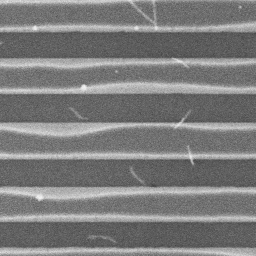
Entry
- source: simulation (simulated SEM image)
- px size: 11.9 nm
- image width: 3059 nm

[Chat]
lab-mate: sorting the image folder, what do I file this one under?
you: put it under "lines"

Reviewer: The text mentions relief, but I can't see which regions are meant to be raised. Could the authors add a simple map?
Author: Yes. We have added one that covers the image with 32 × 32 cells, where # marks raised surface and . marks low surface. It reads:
################################
################################
################################
#############################...
................................
................................
................................
.....................##.........
################################
################################
################################
................................
................................
................................
................................
......................#.........
################################
################################
################################
#############..#################
................................
................................
................................
................................
################################
################################
################################
................................
................................
................................
................................
#############################...